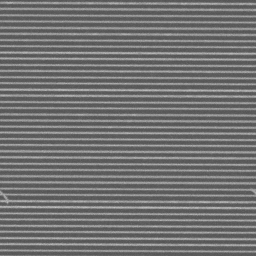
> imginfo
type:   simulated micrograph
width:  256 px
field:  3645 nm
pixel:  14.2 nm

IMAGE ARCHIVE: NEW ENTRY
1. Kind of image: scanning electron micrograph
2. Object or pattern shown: parallel lines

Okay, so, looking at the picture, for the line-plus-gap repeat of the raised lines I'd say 0.0882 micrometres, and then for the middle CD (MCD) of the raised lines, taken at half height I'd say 0.997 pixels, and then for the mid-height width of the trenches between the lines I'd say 0.0694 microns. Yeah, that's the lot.